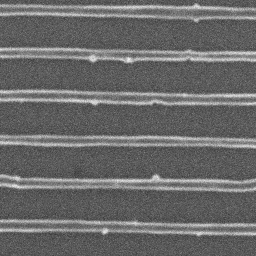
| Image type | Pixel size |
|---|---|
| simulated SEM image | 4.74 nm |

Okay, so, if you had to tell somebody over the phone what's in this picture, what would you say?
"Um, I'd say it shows parallel lines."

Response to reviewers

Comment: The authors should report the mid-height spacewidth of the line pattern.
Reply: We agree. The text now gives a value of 161 nm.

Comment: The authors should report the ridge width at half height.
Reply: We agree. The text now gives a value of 43.8 nm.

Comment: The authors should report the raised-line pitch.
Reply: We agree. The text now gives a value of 204 nm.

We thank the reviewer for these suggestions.